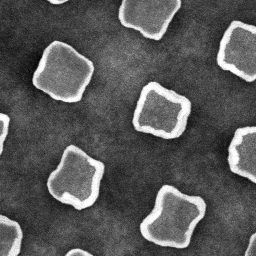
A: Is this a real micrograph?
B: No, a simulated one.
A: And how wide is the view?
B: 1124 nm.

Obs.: raised bodies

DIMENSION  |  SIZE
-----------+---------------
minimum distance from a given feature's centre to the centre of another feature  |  464 nanometres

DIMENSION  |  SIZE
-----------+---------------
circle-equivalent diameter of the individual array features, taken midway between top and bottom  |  53.3 px